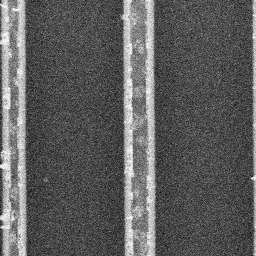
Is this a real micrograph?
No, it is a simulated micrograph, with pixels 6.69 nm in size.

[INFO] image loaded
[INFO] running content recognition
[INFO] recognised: one or a few lines or trenches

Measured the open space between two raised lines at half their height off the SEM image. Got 703 nm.